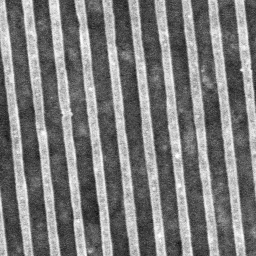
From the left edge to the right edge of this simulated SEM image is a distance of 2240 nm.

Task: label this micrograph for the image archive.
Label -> parallel lines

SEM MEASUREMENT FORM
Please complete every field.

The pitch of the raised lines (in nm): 231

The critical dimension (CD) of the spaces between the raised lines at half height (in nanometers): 159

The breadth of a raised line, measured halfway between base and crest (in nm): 71.8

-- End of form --